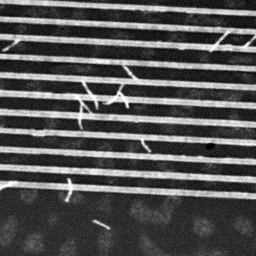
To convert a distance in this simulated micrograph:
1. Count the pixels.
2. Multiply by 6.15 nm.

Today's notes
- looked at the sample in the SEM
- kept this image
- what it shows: parallel lines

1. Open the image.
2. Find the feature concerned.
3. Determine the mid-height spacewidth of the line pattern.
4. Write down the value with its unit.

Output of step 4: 87.5 nm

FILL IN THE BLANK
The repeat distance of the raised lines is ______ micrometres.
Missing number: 0.112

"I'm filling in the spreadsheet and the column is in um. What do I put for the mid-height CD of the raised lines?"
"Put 0.0292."